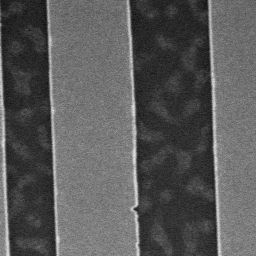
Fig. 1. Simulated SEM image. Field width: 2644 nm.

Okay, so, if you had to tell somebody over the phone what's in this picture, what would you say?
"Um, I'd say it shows one or a few lines or trenches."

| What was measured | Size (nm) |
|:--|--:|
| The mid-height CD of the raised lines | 837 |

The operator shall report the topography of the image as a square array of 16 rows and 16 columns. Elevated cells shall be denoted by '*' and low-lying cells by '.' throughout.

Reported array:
...*****.....***
...*****.....***
...*****.....***
...*****.....***
...*****.....***
...*****.....***
...*****.....***
...*****.....***
...*****.....***
...*****.....***
...*****.....***
...*****......**
...******.....**
....****......**
....*****.....**
....*****.....**